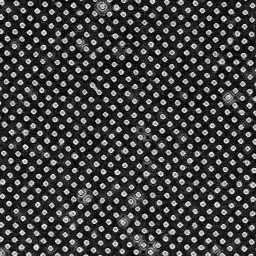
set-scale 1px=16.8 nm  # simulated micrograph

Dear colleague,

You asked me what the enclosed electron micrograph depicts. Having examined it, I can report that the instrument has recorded a regular array of raised bodies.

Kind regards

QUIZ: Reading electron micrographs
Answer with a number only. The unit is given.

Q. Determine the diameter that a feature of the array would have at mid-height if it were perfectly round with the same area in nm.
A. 78.2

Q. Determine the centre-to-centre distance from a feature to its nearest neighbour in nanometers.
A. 166